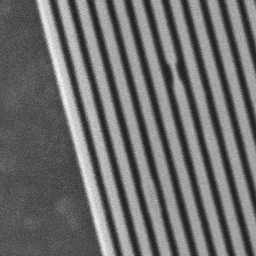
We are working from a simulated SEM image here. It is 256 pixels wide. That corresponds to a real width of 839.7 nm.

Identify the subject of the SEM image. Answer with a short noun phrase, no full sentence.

parallel lines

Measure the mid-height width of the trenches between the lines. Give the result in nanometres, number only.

25.4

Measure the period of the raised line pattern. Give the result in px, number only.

18.1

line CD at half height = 33.7 nm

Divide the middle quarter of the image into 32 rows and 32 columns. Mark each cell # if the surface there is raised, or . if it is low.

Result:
..###..###..##...##..###...#...#
#..##..###..###..##...##...#...#
#..###..##...##..###..##...#...#
#..###..###..##..###..###..##..#
#...##..###..##...##..###..##...
##..###.###..###..##...##..###..
##..###..##..###..###..##..###..
##..###..###..##..###..###..##..
###..##..###..###..##..###..###.
###..##...##..###..##...##..###.
###..###..##..###..###..##...##.
.##..###..###..##...##..###..##.
.###..##..###..###..##..###..###
.###..##...##..###..##...##..###
.###..###..##...##..###..##...##
..##..###..###..##...##..###..##
..###..##..###..###..##..###..##
..###..###..##..###..###..##..##
...##..###..##...##..###..###..#
...##..###..###..##...##..###..#
...###..##..###..###..##..###..#
...###..###..##..###..###..##..#
....##..###..##...##..###..##...
....##...##..###..##...##..###..
....###..##..###..###..##...##..
....###..###..##..###..###..##..
.....##..###..##...##..###..###.
.....##...##..###..##...##..###.
.....###..##..###..###..###..##.
.....###..###..##...##..###..##.
......##..###..###..###.###..###
......###..##..###..###..##..###